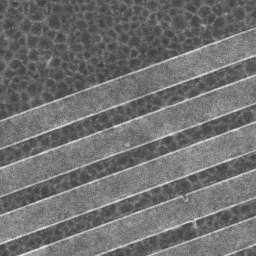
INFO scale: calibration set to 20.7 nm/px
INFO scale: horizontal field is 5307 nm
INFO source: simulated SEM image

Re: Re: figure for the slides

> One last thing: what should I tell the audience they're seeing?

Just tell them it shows parallel lines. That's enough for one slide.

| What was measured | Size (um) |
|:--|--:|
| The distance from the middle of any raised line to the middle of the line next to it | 0.922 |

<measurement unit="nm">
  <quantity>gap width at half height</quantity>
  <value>355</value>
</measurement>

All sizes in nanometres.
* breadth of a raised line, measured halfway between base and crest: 557